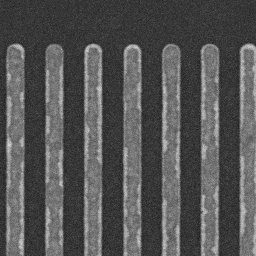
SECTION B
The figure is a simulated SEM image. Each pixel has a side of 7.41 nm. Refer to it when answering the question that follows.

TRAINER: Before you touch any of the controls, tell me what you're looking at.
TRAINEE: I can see parallel lines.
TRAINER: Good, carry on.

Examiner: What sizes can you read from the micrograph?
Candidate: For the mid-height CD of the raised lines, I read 0.12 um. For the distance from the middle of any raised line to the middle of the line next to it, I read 288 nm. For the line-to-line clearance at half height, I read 167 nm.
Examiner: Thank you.